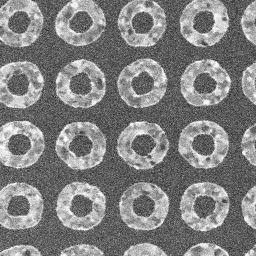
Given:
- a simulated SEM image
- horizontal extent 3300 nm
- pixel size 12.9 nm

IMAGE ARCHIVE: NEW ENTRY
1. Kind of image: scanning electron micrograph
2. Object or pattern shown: a regular array of ring-shaped raised bodies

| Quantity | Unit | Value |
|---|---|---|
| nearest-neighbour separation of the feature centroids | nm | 786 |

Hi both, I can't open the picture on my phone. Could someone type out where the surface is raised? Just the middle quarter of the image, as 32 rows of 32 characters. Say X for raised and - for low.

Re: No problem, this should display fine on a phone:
-XXXXXXX--------XXXXXXXX-------X
XXXXXXXXX------XXXXXXXXXX------X
XXX---XXXX----XXXXX---X-X-----XX
XX-----XXX----XXX-----XXXX----XX
X------XXX----XXX------XXX---XXX
X------XXX----XXX------XX----XXX
X------XXX----XXX-----XXX----XXX
XXX---XXXX----XXXX---XXXX-----XX
XXXXXXXXX------XXXXXXXXX------XX
XXXXXXXX--------XXXXXXX--------X
--XXXXX----------XXXX-----------
--------------------------------
--------------------------------
--------------------------------
--------------------------------
-XXXXXXX--------XXXXXXX--------X
XXXXXXXXX------XXXXXXXXX------XX
XXXXXXXXXX----XXXX---XXXX----XXX
XX----XXXX----X-X-----XXX----XXX
XX-----XXX----XXX------XXX---XXX
X------XXX---XXXX------XXX---XXX
X------XXX---XXXX-----XXXX---XXX
XX----XXXX----X-XX----XXX----XXX
XXXXXXXXX------XXXXXXXXXX-----XX
XXXXXXXXX-------XXXXXXXX-------X
-XXXXXX----------XXXXX----------
--------------------------------
--------------------------------
--------------------------------
--------------------------------
-XXXXXX----------XXXXXX---------
XXXXXXXXX-------XXXXXXXX-------X